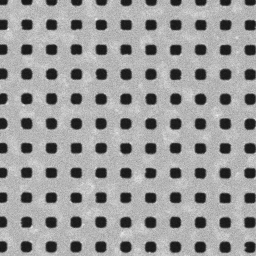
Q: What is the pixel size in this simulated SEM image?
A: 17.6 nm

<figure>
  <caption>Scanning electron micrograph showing a regular array of holes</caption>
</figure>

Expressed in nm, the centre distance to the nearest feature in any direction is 431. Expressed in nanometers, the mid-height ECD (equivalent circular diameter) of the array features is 212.